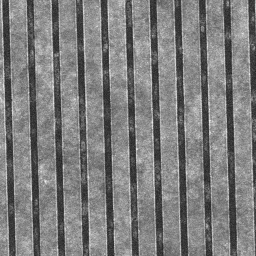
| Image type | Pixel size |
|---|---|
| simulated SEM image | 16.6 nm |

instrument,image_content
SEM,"parallel lines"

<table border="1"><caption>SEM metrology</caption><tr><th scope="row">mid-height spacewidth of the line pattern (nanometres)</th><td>131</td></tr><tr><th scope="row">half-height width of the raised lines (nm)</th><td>285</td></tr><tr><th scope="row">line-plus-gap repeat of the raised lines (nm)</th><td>409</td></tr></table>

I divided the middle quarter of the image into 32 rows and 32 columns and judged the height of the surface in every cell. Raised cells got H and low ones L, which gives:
HHHLLHHHHLLHHHHLLLHHHHLLHHHHLLHH
HHHLLHHHHLLHHHHHLLHHHHLLHHHHLLHH
HHHLLHHHHLLHHHHHLLHHHHLLHHHHLLHH
HHHLLHHHHLLLHHHHLLHHHHLLHHHHLLHH
HHHLLHHHHHLLHHHHLLHHHHLLHHHHLLHH
HHHLLHHHHHLLHHHHLLHHHHLLHHHHLLHH
HHHLLLHHHHLLHHHHLLHHHHLLHHHHLLHH
HHHLLLHHHHLLHHHHLLHHHHLLHHHHLLHH
HHHLLLHHHHLLHHHHLLHHHHLLHHHHLLHH
HHHLLLHHHHLLHHHHLLHHHHLLHHHHLLHH
HHHLLLHHHHLLHHHHLLHHHHLLHHHHLLHH
HHHLLLHHHHLLHHHHLLHHHHLLHHHHLLHH
HHHLLLHHHHLLHHHHLLHHHHLLHHHHLLHH
HHHHLLHHHHLLHHHHLLHHHHLLHHHHLLHH
HHHHLLHHHHLLHHHHLLHHHHLLHHHHLLHH
HHHHLLHHHHLLHHHHLLHHHHLLHHHHLLHH
HHHHLLHHHHLLHHHHLLHHHHLLHHHHLLHH
HHHHLLHHHHLLHHHHLLHHHHLLHHHHLLHH
HHHHLLHHHHLLHHHHLLHHHHLLHHHHLLHH
HHHHLLHHHHLLHHHHLLHHHHLLHHHHLLHH
HHHHLLHHHHLLHHHHLLHHHHLLHHHHLLLH
HHHHLLHHHHLLHHHHLLHHHHLLHHHHLLHH
HHHHLLHHHHLLHHHHLLHHHHLLHHHHLLHH
HHHHLLHHHHLLHHHHLLHHHHLLHHHHLLHH
HHHHLLHHHHLLHHHHLLHHHHLLHHHHLLLH
HHHHLLHHHHLLHHHHLLHHHHLLHHHHHLLH
HHHHLLHHHHLLHHHHLLHHHHLLHHHHHLLH
HHHHLLHHHHLLHHHHLLHHHHLLLHHHHLLH
HHHHLLHHHHLLHHHHLLHHHHLLLHHHHLLH
HHHHLLHHHHLLHHHHLLHHHHLLLHHHHLLH
HHHHLLHHHHLLHHHHLLHHHHLLLHHHHLLH
HHHHLLHHHHLLHHHHLLHHHHLLLHHHHLLH